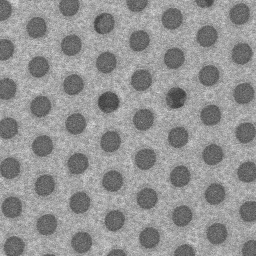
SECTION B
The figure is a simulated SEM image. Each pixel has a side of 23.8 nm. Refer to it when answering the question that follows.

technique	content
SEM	a regular array of holes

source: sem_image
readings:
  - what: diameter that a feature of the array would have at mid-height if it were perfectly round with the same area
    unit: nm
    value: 529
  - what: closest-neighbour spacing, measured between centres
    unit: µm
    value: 0.927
